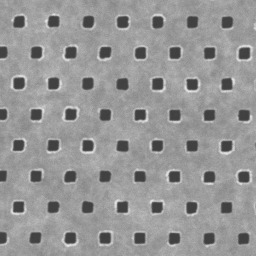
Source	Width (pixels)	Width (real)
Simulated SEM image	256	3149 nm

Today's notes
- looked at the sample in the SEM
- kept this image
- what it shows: a regular array of holes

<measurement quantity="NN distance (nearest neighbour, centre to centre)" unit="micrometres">0.424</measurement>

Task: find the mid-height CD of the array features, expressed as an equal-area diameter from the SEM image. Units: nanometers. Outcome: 158